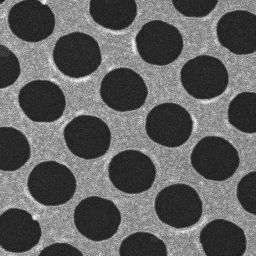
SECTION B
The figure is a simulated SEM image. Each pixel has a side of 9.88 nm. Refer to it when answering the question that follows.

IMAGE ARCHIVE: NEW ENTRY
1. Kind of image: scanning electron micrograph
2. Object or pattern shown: a regular array of holes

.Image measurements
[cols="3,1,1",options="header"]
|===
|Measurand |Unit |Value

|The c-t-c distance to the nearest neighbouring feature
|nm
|564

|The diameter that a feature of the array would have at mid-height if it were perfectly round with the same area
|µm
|0.458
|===